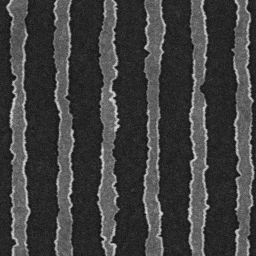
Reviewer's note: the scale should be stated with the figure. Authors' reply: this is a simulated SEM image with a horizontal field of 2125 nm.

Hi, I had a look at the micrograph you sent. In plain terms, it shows parallel lines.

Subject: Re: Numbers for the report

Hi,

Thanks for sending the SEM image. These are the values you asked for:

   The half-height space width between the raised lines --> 256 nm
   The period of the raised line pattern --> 372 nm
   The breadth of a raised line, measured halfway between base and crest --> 117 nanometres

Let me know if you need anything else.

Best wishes